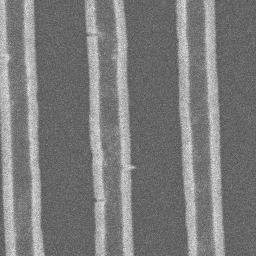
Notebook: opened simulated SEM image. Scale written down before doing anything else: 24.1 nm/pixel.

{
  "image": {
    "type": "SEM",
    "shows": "one or a few lines or trenches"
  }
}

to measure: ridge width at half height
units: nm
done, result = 739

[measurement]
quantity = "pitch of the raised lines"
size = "2170 nm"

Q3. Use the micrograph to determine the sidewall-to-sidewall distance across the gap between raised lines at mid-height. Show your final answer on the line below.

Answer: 1420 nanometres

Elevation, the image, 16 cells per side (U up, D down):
UUDDDDUUDDDUUDDD
UUDDDDUUDDDUUDDD
UUDDDDUUDDDUUDDD
UUDDDDUUDDDUUDDD
UUDDDDUUDDDUUDDD
UUDDDDUUDDDUUDDD
UUDDDDUUDDDUUDDD
UUDDDDUUDDDUUDDD
UUDDDDUUDDDDUDDD
UUDDDDUUDDDDUUDD
UUDDDDUUDDDDUUDD
UUDDDDUUDDDDUUDD
UUDDDDUUDDDDUUDD
UUDDDDUUDDDDUUDD
DUDDDDUUDDDDUUDD
DUUDDDUUDDDDUUDD